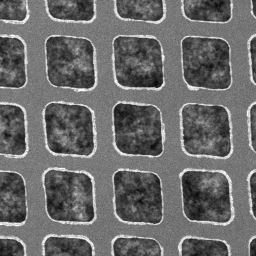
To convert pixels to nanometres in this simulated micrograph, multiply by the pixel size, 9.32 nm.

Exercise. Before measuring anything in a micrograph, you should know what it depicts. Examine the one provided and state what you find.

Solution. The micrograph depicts a regular array of holes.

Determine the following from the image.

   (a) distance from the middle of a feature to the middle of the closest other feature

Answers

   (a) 624 nm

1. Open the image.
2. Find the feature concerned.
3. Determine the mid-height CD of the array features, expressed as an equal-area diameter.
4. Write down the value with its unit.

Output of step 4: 509 nanometers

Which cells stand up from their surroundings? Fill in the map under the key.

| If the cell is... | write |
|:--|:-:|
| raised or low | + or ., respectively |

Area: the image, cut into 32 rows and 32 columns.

...+++......++......+++......++.
...+++......+++......++......+++
...+++++...++++++...++++.....+++
++++++++++++++++++++++++++++++++
+++++++.+++++++.++++++++++++++++
...+++.....+++......+++.....+++.
...+++......++......+++......++.
...+++......++......+++......++.
...+++......++......+++......++.
...+++......++......+++......+++
...++++.....+++.....++++.....+++
++++++++++++++++++++++++++++++++
++++++++++++++++++++++++++++++++
...+++.....+++......+++.....+++.
...+++......++......+++......++.
...+++......++......+++......++.
...+++......++......+++......++.
...+++......++......+++......++.
...+++......+++.....+++......+++
++++++++++++++++++..++++++..++++
++++++++++++++++++++++++++++++++
..++++...++++++....++++....+++++
...++......+++......+++.....+++.
...+++......++......+++......++.
...+++......++......+++......++.
...+++......++......+++......++.
...+++......+++.....+++......+++
...++++.....+++.....++++.....+++
++++++++++++++++++++++++++++++++
++++++++++++++++++++++++++++++++
...+++.....+++......+++.....+++.
...+++......++......+++......++.